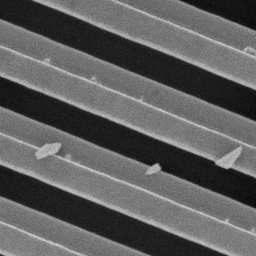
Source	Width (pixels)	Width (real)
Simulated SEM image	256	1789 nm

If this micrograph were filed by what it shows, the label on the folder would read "lines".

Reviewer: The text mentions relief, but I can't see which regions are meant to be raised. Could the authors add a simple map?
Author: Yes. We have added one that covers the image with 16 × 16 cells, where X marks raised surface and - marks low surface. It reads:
---XXXXXXXXX----
X-----XXXXXXXXX-
XXX-----XXXXXXXX
XXXXXX-----XXXXX
XXXXXXXX-----XXX
--XXXXXXXXX-----
----XXXXXXXXX---
XX-----XXXXXXXXX
XXXXX----XXXXXXX
XXXXXXX-----XXXX
-XXXXXXXXX----XX
---XXXXXXXXX----
X-----XXXXXXXXX-
XXX-----XXXXXXXX
XXXXXX-----XXXXX
XXXXXXXX-----XXX